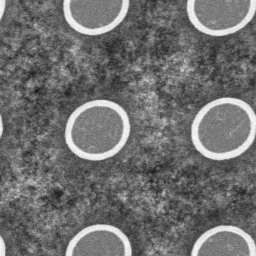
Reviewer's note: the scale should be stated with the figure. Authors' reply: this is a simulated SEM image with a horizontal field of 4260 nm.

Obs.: raised bodies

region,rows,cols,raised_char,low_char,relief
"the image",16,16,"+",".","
....++++....++++
.....++.....+++.
................
................
................
................
......+......++.
....++++....++++
....++++....++++
.....++......++.
................
................
................
................
.....++......++.
....++++....++++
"